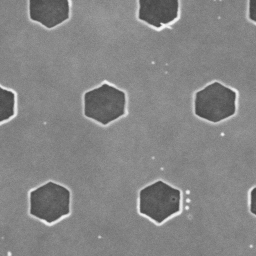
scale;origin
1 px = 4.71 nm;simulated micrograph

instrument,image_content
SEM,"holes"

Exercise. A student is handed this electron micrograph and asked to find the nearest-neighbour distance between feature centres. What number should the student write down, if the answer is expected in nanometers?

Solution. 517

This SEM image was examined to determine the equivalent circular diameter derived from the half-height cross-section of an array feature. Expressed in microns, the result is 0.187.